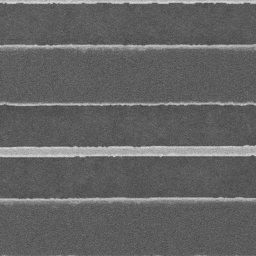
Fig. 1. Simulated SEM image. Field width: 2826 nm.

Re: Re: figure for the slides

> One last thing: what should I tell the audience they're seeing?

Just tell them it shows lines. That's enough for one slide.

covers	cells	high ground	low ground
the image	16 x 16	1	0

0000000000000000
0000000000000000
0000000000000000
1111111111111111
1111111111111111
1111111111111111
1111111111100111
0000000000000000
0000000000000000
0000000000000000
0000000000000000
0000000000000000
1101111111111111
1111111111111111
1111111111111111
1111111111111111